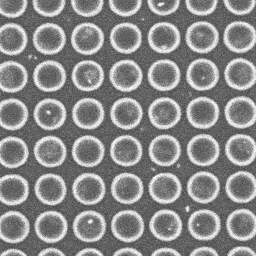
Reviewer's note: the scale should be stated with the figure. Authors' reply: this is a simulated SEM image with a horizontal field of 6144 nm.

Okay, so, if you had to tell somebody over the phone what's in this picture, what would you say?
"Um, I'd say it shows a regular array of raised bodies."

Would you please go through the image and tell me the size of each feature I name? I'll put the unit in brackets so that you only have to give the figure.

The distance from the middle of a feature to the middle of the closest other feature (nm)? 897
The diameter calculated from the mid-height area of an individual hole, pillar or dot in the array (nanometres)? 699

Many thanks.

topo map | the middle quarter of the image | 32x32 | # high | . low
...######....#####....######....
...######...#######...######...#
..########..#######...######...#
..########..#######...######...#
...######...#######...######....
...#####.....#####.....####.....
................................
................................
................................
....####......####.....####.....
...######....######...######...#
...######...#######...#######..#
...#######..#######...#######..#
...######...#######...#######..#
...######....######...######....
.....###......###.......###.....
................................
................................
.....##.......###.......###.....
...######....#####....######....
...######...#######...#######..#
...#######..#######...#######..#
...#######..#######...#######..#
...######...#######...######....
....#####....#####.....####.....
................................
................................
................................
....#####....#####.....#####....
...#######...######...#######...
...#######..#######...#######..#
..########..#######...#######..#